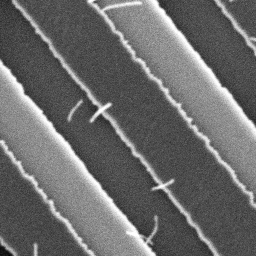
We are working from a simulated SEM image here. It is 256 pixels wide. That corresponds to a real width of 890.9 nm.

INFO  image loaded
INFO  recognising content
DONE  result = lines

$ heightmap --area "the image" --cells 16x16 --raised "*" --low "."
.*********....**
..*********....*
...*********...*
...*********....
*...*********...
*....*********..
**....*********.
***....*********
****....********
*****...********
*****....*******
******....******
*******....*****
********....****
*********...****
*********....***